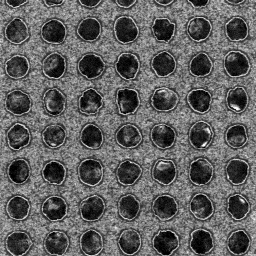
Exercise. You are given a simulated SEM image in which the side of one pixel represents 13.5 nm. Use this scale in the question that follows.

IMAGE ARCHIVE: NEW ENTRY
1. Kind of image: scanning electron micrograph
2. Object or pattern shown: a regular array of holes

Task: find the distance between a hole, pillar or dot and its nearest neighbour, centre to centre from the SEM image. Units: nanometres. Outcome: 471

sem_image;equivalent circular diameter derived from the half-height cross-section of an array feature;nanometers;312